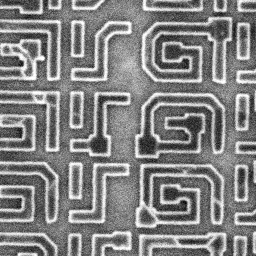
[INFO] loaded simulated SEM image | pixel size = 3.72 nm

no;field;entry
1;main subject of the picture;wiring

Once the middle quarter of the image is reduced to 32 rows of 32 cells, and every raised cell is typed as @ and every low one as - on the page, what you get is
--------@@----------@@@---------
--@@@@@@@@@---------@@@@-------@
--@@@@@@@@@----------@@@@@@@@@@@
--@@@@@@@@------------@@@@@@@@@@
--------------------------------
--------------------------------
--------------------------------
--@@@---@@@@@@@@----------------
--@@@---@@@@@@@@------@@@@@@@@@@
--@@@---@@@@@@@@-----@@@@@@@@@@@
--@@----@@----------@@@@--------
--@@----@@----------@@@---------
--@@----@@----------@@----------
--@@----@@----------@@----@@@@@@
--@@----@@---------@@@---@@@@@@@
--@@----@@---------@@@---@@@@@@@
--------@@---------@@@--------@@
-------@@@---------@@@@--------@
------@@@@@@------@@@@@@-------@
--@@@@@@@@@@------@@@@@@@@@@@@@@
--@@@@@@@@@@------@@@@@@@@@@@@@@
--@@@@@@@@@-------@@@@@@@@@@@@@@
-------@@@@-------@@@@@@--------
--------------------------------
--------------------------------
--@@----@@@@@@@@---@@@@@@@@@@@@@
--@@----@@@@@@@@---@@@@@@@@@@@@@
--@@----@@@@@@@@---@@@@@@@@@@@@@
--@@---@@@---------@@@----------
--@@---@@@---------@@@----------
--@@----@@---------@@@--@@@@@---
--@@----@@---------@@@--@@@@@@@@